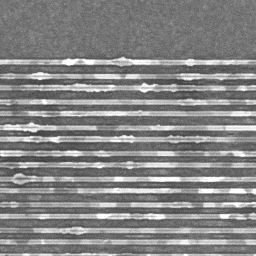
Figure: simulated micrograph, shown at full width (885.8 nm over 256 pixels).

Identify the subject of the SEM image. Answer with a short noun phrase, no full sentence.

parallel lines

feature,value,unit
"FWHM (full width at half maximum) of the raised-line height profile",0.0134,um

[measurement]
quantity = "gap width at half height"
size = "30.2 nm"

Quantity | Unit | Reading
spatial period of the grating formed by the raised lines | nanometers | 44.3